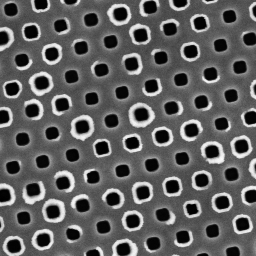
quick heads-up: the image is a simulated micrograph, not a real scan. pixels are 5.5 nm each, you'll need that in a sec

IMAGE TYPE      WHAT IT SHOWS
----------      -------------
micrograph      a regular array of holes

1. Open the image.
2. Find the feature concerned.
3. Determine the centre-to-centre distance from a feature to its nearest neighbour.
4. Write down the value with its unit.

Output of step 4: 163 nm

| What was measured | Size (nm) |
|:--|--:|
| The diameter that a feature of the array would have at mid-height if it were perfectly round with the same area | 72.4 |